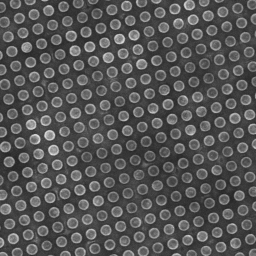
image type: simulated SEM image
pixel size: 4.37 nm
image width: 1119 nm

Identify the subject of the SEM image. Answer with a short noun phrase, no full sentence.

a regular array of raised bodies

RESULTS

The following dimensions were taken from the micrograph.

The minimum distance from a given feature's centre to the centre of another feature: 65.6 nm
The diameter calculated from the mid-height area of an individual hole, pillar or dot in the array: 0.0438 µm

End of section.